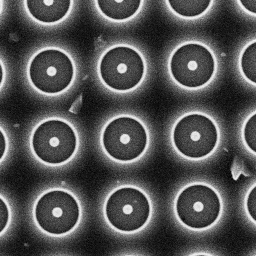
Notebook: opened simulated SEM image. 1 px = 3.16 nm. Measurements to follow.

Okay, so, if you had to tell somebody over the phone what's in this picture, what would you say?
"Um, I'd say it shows an array of small figures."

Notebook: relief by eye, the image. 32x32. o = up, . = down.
ooo......ooo......ooo.....oooo..
oooo.....oooo....ooooo....ooooo.
ooooo..ooooooo.ooooooooooooooooo
oooooooooooooooooooooooooooooooo
oooooooooooooooooooooooooooooooo
ooooooooooooooooooooooo..oooooo.
ooooo...ooooo....ooooo....oooo..
oooo.....oooo.....ooo......ooo..
oooo.....ooo......ooo......ooo..
oooo.....oooo.....oooo.....oooo.
oooo.....oooo....ooooo....oooooo
ooooo...oooooooooooooooooooooooo
oooooooooooooooooooooooooooooooo
oooooooooooooooooooooooooooooooo
ooooooooooooooooooooooo...ooooo.
ooooo....ooooo....oooo.....oooo.
oooo.....oooo.....oooo.....ooo..
.ooo......ooo.....oooo.....oooo.
.ooo.....oooo.....oooo.....oooo.
ooooo....ooooo...oooooo...oooooo
oooooo.ooooooooooooooooooooooooo
oooooooooooooooooooooooooooooooo
oooooooooooooooooooooooooooooooo
ooooooooooooooo..oooooo...oooooo
ooooo....ooooo....oooo.....oooo.
.oooo.....ooo......ooo......ooo.
.ooo......ooo......ooo......ooo.
.ooo......oooo....ooooo....ooooo
.oooo....ooooo....oooooo..oooooo
oooooooooooooooooooooooooooooooo
oooooooooooooooooooooooooooooooo
oooooooooooooooooooooooooooooooo